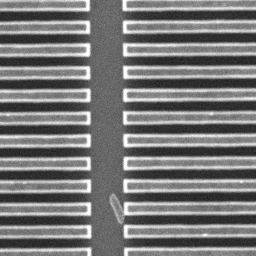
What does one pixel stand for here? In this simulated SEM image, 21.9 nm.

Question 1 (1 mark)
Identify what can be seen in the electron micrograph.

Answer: groups of lines, slits or small figures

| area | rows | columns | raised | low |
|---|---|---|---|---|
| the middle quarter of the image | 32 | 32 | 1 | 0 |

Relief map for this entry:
00000000000000000000000000000000
11111100000000011111111111111111
11111100000000011111111111111111
00000000000000000000000000000000
00000000000000000000000000000000
00000000000000000000000000000000
00000000000000000000000000000000
11111100000000011111111111111111
11111100000000011111111111111111
00000000000000000000000000000000
00000000000000000000000000000000
00000000000000000000000000000000
11111100000000011111111111111111
11111100000000011111111111111111
11111100000000011111111111111111
00000000000000000000000000000000
00000000000000000000000000000000
00000000000000000000000000000000
11111100000000011111111111111111
11111100000000011111111111111111
00000000000000000000000000000000
00000000000000000000000000000000
00000000000000000000000000000000
00000000000000000000000000000000
11111100000000011111111111111111
11111100000000011111111111111111
00000000000000000000000000000000
00000000000000000000000000000000
00000000000000000000000000000000
11111100000000011111111111111111
11111100000000011111111111111111
11111100000000011111111111111111